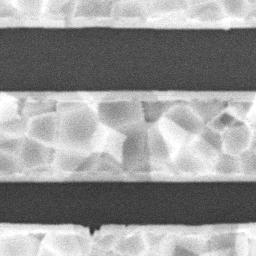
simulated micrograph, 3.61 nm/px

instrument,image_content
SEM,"one or a few lines or trenches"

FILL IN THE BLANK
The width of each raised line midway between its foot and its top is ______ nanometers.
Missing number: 301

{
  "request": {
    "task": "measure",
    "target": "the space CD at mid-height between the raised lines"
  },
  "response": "234 nanometers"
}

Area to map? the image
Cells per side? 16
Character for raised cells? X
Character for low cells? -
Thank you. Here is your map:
XXXXXXXXXXXXXXXX
----------------
----------------
----------------
----------------
----------------
XXXXXXXXXXXXXXXX
XXXXXXXXXXXXXXXX
XXXXXXXXXXXXXXXX
XXXXXXXXXXXXXXXX
XXXXXXXXXXXXXXXX
----------------
----------------
----------------
XXXXX-XXXXXXXXXX
XXXXXXXXXXXXXXXX